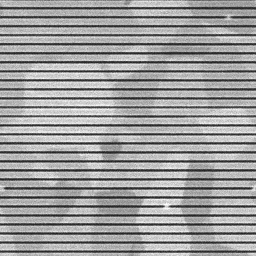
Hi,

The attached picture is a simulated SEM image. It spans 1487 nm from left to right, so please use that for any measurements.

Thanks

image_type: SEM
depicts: parallel lines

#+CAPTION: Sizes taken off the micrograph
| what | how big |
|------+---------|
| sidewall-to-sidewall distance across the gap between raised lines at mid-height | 3.63 pixels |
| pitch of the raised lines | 52.4 nanometers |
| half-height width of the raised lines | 31.2 nanometres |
